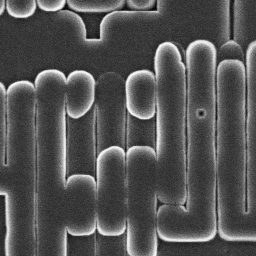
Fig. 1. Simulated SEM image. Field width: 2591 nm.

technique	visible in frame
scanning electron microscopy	wiring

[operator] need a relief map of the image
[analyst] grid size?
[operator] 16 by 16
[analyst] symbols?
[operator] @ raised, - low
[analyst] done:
@@--------------
----------------
----------------
----------@@@@-@
---@-----@@@@@@@
@@@@@@--@@@@@@@@
@@@@@@--@@@@@@@@
@@@@------@@@@@@
@@@@------@@@@@@
@@@@--@@@@@@@@@@
@@@@--@@@@@@@@@@
@@@@@@@@@@@@@@@@
@@@@@@@@@@@@@@@@
@@@@@@@@@@@@@@@@
@@@@@@@@@@@@@@@@
@@@@----@@------